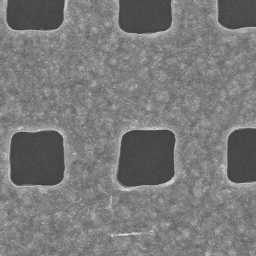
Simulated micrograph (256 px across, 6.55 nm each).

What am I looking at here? holes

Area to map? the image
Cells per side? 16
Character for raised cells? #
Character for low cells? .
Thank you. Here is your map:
....###....###..
#...###....###..
################
################
################
################
################
################
#...####...###..
#...####...###..
#...###....###..
#..#####..######
################
################
################
################